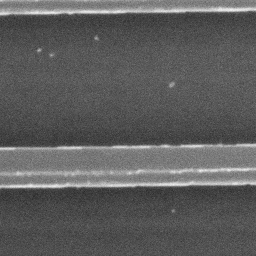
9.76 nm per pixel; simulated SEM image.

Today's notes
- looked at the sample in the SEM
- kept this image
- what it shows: lines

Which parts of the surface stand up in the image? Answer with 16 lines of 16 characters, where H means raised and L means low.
HHHHHHHHHHHHHHHH
LLLLLLLLLLLLLLLL
LLLLLLLLLLLLLLLL
LLLLLLLLLLLLLLLL
LLLLLLLLLLLLLLLL
LLLLLLLLLLLLLLLL
LLLLLLLLLLLLLLLL
LLLLLLLLLLLLLLLL
LLLLLLLLLLLLLLLL
HHHHHHHHHHHHHHHH
HHHHHHHHHHHHHHHH
HHHHHHHHHHHHHHHL
LLLLLLLLLLLLLLLL
LLLLLLLLLLLLLLLL
LLLLLLLLLLLLLLLL
LLLLLLLLLLLLLLLL